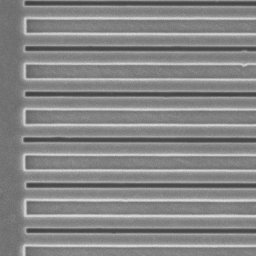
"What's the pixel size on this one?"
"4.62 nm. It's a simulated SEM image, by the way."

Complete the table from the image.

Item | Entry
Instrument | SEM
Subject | parallel lines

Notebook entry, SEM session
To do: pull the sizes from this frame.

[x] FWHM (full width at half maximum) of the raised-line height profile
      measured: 59.5 nm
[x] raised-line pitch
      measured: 105 nm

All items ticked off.